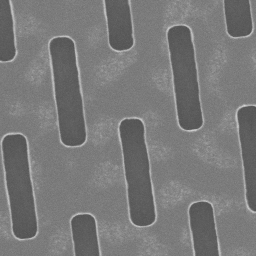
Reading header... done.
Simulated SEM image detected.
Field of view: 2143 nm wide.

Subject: holes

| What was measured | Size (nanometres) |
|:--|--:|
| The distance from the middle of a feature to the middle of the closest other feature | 889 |